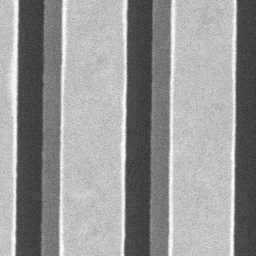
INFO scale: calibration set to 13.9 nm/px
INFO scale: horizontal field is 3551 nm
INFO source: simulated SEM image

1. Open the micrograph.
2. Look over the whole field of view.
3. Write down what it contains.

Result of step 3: lines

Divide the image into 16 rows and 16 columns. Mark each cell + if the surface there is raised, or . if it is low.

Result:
+...++++...++++.
+...++++...++++.
+...++++...++++.
+...++++...++++.
+...++++...++++.
+...++++...++++.
+...++++...++++.
+...++++...++++.
+...++++...++++.
+...++++...++++.
+...++++...++++.
+...++++...++++.
+...++++...++++.
+...++++...++++.
+...++++...++++.
+...++++...++++.